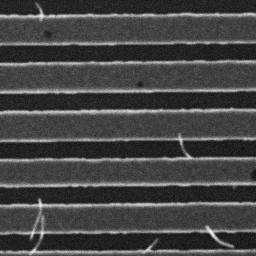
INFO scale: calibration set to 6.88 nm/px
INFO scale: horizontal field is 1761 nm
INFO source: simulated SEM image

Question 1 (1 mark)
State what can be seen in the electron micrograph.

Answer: lines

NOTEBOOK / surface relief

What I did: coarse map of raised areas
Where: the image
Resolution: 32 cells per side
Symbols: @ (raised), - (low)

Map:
--------------------------------
--------------------------------
@@@@@@@@@@@@@@@@@@@@@@@@@@@@@@@@
@@@@@@@@@@@@@@@@@@@@@@@@@@@@@@@@
@@@@@@@@@@@@@@@@@@@@@@@@@@@@@@@@
@@@@@@@@@@@@@@@-----------------
--------------------------------
--------------------------------
@@@@@@@@@@@@@@@@@@@@@@@@@@@@@@@@
@@@@@@@@@@@@@@@@@@@@@@@@@@@@@@@@
@@@@@@@@@@@@@@@@@@@@@@@@@@@@@@@@
@@@@@@@@@@@@@@@@@-@-------------
--------------------------------
--------------------------------
@@@@@@@@@@@@@@@@@@@@@@@@@@@@@@@@
@@@@@@@@@@@@@@@@@@@@@@@@@@@@@@@@
@@@@@@@@@@@@@@@@@@@@@@@@@@@@@@@@
@@@@@@@@@@@@@@@@------@---------
--------------------------------
--------------------------------
@@@@@@@@@@@@@@@@@@@@@@@@@@@@@@@@
@@@@@@@@@@@@@@@@@@@@@@@@@@@@@@@@
@@@@@@@@@@@@@@@@@@@@@@@@@@@@@@@@
--------------------------------
--------------------------------
--------------@@@@@@@@@@@@@@@@@@
@@@@@@@@@@@@@@@@@@@@@@@@@@@@@@@@
@@@@@@@@@@@@@@@@@@@@@@@@@@@@@@@@
@@@@@@@@@@@@@@@@@@@@@@@@@@@@@@@@
--------------------------------
--------------------------------
----@@@@@@@@@@@@@@@@@@@@@@@@@@@@